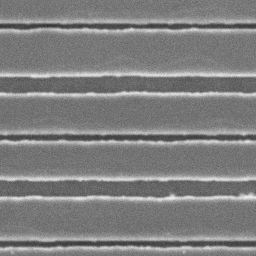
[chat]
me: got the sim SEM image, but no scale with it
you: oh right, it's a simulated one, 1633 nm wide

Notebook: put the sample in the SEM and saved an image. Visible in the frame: lines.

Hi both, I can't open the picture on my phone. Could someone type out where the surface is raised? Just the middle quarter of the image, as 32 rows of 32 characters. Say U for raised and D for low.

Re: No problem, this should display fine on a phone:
UUUUUUUUUUUUUUUUUUUUUUUUUUUUUUUU
UUUUUUUUUUUUUUUUUUUUUUUUUUUUUUUU
UUUUUUUUUUUUUUDDUUUUUUUUUUUUUUUU
DDDDDDDDDDDDDDDDDDDDDDDDDDDDDDDD
DDDDDDDDDDDDDDDDDDDDDDDDDDDDDDDD
DDDDDDDDDDDDDDDDDDDDDDDDDDDDDDDD
DDDDDDDDDDDDDDDDDDDDDDDDDDDDDDDD
DDDDDDUUDDDDDUUUUUUUUUUUUUUUUUUU
UUUUUUUUUUUUUUUUUUUUUUUUUUUUUUUU
UUUUUUUUUUUUUUUUUUUUUUUUUUUUUUUU
UUUUUUUUUUUUUUUUUUUUUUUUUUUUUUUU
UUUUUUUUUUUUUUUUUUUUUUUUUUUUUUUU
UUUUUUUUUUUUUUUUUUUUUUUUUUUUUUUU
UUUUUUUUUUUUUUUUUUUUUUUUUUUUUUUU
UUUUUUUUUUUUUUUUUUUUUUUUUUUUUUUU
UUUUUUUUUUUUUUUUUUUUUUUUUUUUUUUU
UUUUUUUUUUUUUUUUUUUUUUUUUUUUUUUU
DDDDDDDDDDDDDDDDDDDDDDDDDDDDDDDD
DDDDDDDDDDDDDDDDDDDDDDDDDDDDDDDD
UUUUUUUUUUUUUUUUUUUUUUUUUDDUUUUU
UUUUUUUUUUUUUUUUUUUUUUUUUUUUUUUU
UUUUUUUUUUUUUUUUUUUUUUUUUUUUUUUU
UUUUUUUUUUUUUUUUUUUUUUUUUUUUUUUU
UUUUUUUUUUUUUUUUUUUUUUUUUUUUUUUU
UUUUUUUUUUUUUUUUUUUUUUUUUUUUUUUU
UUUUUUUUUUUUUUUUUUUUUUUUUUUUUUUU
UUUUUUUUUUUUUUUUUUUUUUUUUUUUUUUU
UUUUUUUUUUUUUUUUUUUUUUUUUUUUUUUU
UUUUUUUUUUUUUUUUUUUUUUUUUUUUUUUU
DDDDDDDDDDDDDDDDDDDDDDDDDDDDDDDD
DDDDDDDDDDDDDDDDDDDDDDDDDDDDDDDD
DDDDDDDDDDDDDDDDDDDDDDDDDDDDDDDD